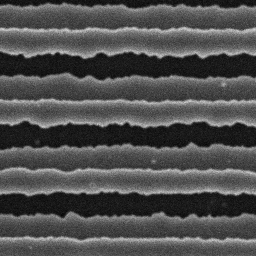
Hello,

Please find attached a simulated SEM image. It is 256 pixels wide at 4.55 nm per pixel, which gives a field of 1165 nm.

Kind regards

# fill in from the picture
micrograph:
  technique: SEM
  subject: lines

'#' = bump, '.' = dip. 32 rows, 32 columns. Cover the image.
......#.#.......................
################################
################################
################################
################################
################################
################################
................................
................................
..#...###.......................
################################
################################
################################
################################
################################
.#..####....##..#####.....###..#
................................
................................
...#.#.############.##.#########
################################
################################
################################
################################
################################
................................
................................
................................
################################
################################
################################
################################
################################